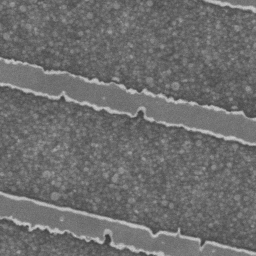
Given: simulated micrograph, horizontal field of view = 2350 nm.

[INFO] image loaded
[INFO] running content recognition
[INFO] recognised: one or a few lines or trenches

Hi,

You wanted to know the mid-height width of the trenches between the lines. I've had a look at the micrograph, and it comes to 977 nanometres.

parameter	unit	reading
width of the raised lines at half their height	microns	0.229